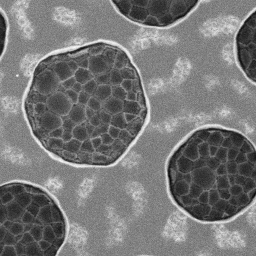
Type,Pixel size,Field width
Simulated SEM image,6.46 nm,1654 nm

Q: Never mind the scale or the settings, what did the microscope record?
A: holes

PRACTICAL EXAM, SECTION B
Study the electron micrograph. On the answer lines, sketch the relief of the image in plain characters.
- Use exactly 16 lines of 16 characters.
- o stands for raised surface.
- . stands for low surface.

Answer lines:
ooooooo.....oooo
ooooooooo..oooo.
ooooooooooooooo.
ooo.....ooooooo.
oo.......oooooo.
oo.......ooooooo
oo.......ooooooo
oo.......ooooooo
oo.......ooo...o
ooo.....ooo.....
oooooooooo......
..ooooooooo.....
...oooooooo.....
....oooooooo...o
....oooooooooooo
....oooooooooooo